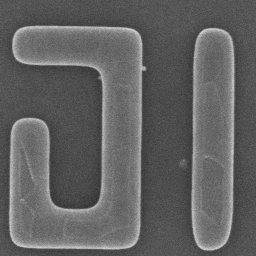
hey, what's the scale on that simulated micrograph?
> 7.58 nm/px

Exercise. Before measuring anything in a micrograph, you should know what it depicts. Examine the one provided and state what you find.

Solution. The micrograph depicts wiring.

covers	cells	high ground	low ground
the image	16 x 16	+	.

................
................
.++++++++...++..
.++++++++...+++.
......+++...+++.
......+++...+++.
......+++...+++.
.+....+++...+++.
.++...+++...+++.
.++...+++...+++.
.++...+++...+++.
.++...+++...+++.
.++...+++...+++.
.++++++++...+++.
.++++++++...++..
..++++++.....+..